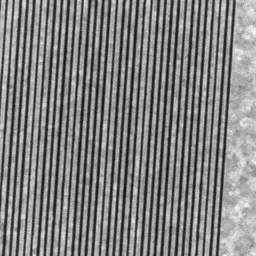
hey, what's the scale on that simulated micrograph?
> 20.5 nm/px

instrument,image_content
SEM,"parallel lines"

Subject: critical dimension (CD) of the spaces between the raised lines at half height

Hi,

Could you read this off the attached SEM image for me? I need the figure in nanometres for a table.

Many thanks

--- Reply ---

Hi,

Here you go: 69.2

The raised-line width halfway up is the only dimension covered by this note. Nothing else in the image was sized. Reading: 69.2 nanometers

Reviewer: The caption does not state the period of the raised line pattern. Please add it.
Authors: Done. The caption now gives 141 nm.